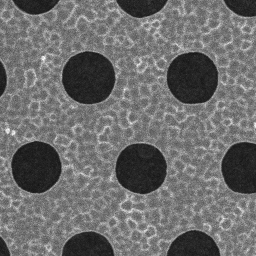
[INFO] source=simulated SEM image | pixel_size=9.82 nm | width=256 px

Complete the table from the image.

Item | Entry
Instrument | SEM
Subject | holes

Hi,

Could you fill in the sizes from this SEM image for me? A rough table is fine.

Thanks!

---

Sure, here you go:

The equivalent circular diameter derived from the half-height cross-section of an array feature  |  0.512 microns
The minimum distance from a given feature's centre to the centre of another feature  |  1020 nm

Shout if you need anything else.